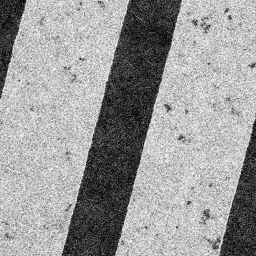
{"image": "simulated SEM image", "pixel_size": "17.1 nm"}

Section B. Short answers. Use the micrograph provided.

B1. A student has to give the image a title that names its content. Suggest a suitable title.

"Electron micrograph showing one or a few lines or trenches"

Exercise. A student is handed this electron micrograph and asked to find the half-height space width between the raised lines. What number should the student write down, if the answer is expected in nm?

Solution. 901